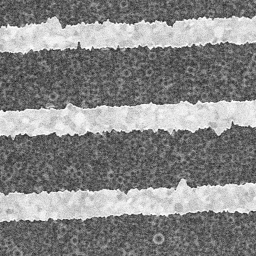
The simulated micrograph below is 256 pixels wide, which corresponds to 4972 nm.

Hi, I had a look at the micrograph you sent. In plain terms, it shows one or a few lines or trenches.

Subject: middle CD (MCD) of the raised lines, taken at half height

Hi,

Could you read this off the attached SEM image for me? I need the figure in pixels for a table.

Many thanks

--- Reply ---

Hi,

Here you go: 25.2